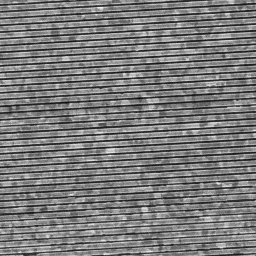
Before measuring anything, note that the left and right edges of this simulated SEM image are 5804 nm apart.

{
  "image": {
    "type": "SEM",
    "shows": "parallel lines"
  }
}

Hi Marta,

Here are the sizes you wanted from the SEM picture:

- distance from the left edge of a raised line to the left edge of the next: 6.74 pixels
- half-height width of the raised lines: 3.87 pixels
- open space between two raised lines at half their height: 65.1 nm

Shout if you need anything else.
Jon